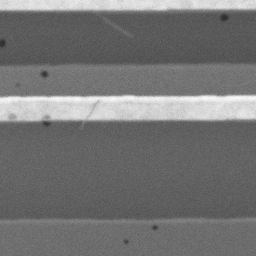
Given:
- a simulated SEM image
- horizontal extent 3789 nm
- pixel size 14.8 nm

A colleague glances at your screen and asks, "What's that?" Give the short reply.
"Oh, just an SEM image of lines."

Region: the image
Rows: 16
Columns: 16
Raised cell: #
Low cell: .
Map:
################
................
................
................
################
################
################
######.##.......
................
................
................
................
................
................
################
################